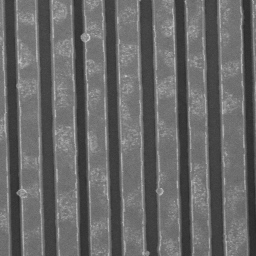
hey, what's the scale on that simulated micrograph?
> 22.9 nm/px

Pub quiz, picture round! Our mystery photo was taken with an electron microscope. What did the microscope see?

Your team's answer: parallel lines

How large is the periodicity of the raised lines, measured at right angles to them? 0.78 µm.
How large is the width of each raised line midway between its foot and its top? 0.484 um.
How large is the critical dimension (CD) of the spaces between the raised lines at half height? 272 nm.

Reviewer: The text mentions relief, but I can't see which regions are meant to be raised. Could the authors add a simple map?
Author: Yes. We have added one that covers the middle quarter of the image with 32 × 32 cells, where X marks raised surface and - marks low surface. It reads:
XX---XXXXX---XXXXXX----XXXXX---X
XX---XXXXX----XXXXX----XXXXX---X
XXX--XXXXX----XXXXX----XXXXX---X
XXX--XXXXX----XXXXX----XXXXX---X
XXX--XXXXX----XXXXX----XXXXX---X
XXX--XXXXX----XXXXX----XXXXX---X
XXX---XXXX----XXXXX----XXXXX---X
XXX---XXXX----XXXXX----XXXXX---X
XXX---XXXX----XXXXX----XXXXX---X
XXX---XXXX----XXXXX----XXXXX---X
XXX---XXXX----XXXXX----XXXXX---X
XXX---XXXX----XXXXX----XXXXX---X
XXX---XXXXX---XXXXX----XXXXX---X
XXX---XXXXX---XXXXX----XXXXX---X
XXX---XXXXX---XXXXX----XXXXX---X
XXX---XXXXX---XXXXX----XXXXX---X
XXX---XXXXX---XXXXX----XXXXX---X
XXX---XXXXX---XXXXXX---XXXXX---X
XXX---XXXXX---XXXXXX---XXXXX---X
XXX---XXXXX---XXXXXX---XXXXX---X
XXX---XXXXX---XXXXXX---XXXXX---X
XXX---XXXXX---XXXXXX---XXXXXX--X
XXX---XXXXX---XXXXX----XXXXXX--X
XXX---XXXXX---XXXXX----XXXXXX--X
XXX---XXXXX---XXXXXX----XXXXX--X
XXX---XXXXX---XXXXXX----XXXXX--X
XXX---XXXXX---XXXXXX----XXXXX--X
XXX---XXXXX---XXXXXX---XXXXXX--X
XXX---XXXXX---XXXXXX---XXXXX---X
XXX---XXXXX---XXXXXX---XXXXXX---
XXX---XXXXX---XXXXXX---XXXXXX---
XXX---XXXXX---XXXXXX---XXXXXX---